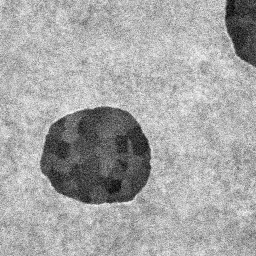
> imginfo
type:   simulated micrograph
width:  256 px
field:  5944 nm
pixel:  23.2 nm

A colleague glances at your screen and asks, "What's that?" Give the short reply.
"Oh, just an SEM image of raised bodies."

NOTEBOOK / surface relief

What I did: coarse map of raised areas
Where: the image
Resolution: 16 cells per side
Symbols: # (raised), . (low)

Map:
..............##
..............##
..............##
...............#
................
................
................
....#####.......
...######.......
...######.......
..#######.......
...######.......
.....###........
................
................
................